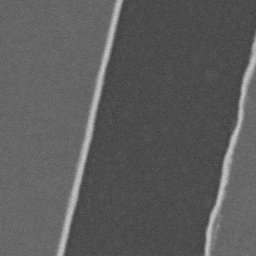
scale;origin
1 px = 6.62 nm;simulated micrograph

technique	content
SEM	one or a few lines or trenches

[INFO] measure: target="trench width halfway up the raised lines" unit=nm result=935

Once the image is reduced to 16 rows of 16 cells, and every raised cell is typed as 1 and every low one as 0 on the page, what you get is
1111111000000000
1111111000000000
1111111000000000
1111111000000000
1111110000000000
1111110000000001
1111110000000001
1111110000000001
1111110000000001
1111100000000011
1111100000000011
1111100000000011
1111100000000011
1111000000000111
1111000000000111
1111000000000111